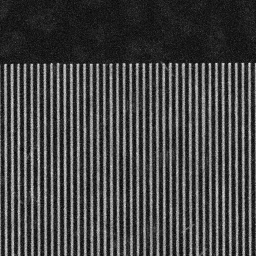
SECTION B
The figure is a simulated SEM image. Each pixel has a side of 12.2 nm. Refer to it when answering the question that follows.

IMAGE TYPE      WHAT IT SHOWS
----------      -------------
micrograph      parallel lines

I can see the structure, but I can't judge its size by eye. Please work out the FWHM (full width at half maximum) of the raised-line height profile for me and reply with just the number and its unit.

25.8 nanometers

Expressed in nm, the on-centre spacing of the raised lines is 80.6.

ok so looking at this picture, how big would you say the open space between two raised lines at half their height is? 53.2 nm